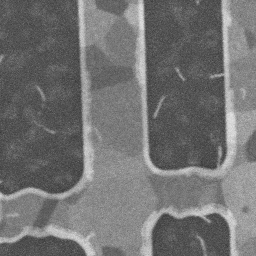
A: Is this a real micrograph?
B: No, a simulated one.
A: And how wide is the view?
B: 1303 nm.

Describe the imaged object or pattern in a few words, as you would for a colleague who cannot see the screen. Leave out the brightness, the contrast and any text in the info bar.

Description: one or a few lines or trenches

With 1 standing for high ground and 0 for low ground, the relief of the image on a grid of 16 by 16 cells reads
0000011110000011
0000011110000011
0000011110000011
0000011110000011
0000011110000011
0000011110000011
0000011110000011
0000011110000011
0000011110000011
0000011110000011
0000011111000011
0000011111111111
1111111111111111
1111111111000011
1111111110000011
0000011110000001